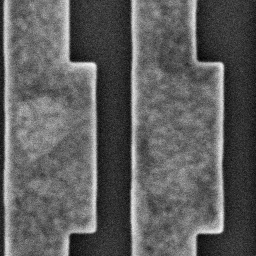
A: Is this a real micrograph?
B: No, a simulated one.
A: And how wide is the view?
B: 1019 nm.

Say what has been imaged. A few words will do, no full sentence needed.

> wiring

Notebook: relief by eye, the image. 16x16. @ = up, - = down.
@@@@----@@@@----
@@@@----@@@@----
@@@@----@@@@----
@@@@----@@@@----
@@@@@@--@@@@@@--
@@@@@@--@@@@@@--
@@@@@@--@@@@@@--
@@@@@@--@@@@@@--
@@@@@@--@@@@@@--
@@@@@@--@@@@@@--
@@@@@@--@@@@@@--
@@@@@@--@@@@@@--
@@@@@@--@@@@@@--
@@@@@@--@@@@@@--
@@@@@---@@@@@---
@@@@----@@@@----